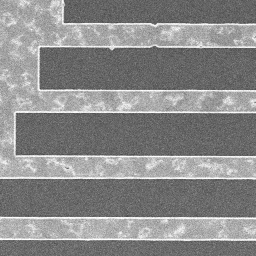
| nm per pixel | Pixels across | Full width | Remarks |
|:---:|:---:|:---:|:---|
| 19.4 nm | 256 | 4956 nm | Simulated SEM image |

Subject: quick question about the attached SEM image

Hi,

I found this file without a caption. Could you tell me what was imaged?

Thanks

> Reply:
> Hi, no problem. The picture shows one or a few lines or trenches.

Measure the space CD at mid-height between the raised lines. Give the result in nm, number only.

849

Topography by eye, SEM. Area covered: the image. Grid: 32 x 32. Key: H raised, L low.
HHHHHHHHLLLLLLLLLLLLLLLLLLLLLLLL
HHHHHHHHLLLLLLLLLLLLLLLLLLLLLLLL
HHHHHHHHLLLLLLLLLLLLLLLLLLLLLLLL
HHHHHHHHHHHHHHHHHHHHHHHHHHHHHHHH
HHHHHHHHHHHHHHHHHHHHHHHHHHHHHHHH
HHHHHHHHHHHHHHHHHHHHHHHHHHHHHHHH
HHHHHLLLLLLLLLLLLLLLLLLLLLLLLLLL
HHHHHLLLLLLLLLLLLLLLLLLLLLLLLLLL
HHHHHLLLLLLLLLLLLLLLLLLLLLLLLLLL
HHHHHLLLLLLLLLLLLLLLLLLLLLLLLLLL
HHHHHLLLLLLLLLLLLLLLLLLLLLLLLLLL
HHHHHHHHHHHHHHHHHHHHHHHHHHHHHHHH
HHHHHHHHHHHHHHHHHHHHHHHHHHHHHHHH
HHHHHHHHHHHHHHHHHHHHHHHHHHHHHHHH
HHLLLLLLLLLLLLLLLLLLLLLLLLLLLLLL
HHLLLLLLLLLLLLLLLLLLLLLLLLLLLLLL
HHLLLLLLLLLLLLLLLLLLLLLLLLLLLLLL
HHLLLLLLLLLLLLLLLLLLLLLLLLLLLLLL
HHLLLLLLLLLLLLLLLLLLLLLLLLLLLLLL
HHLLLLLLLLLLLLLLLLLLLLLLLLLLLLLL
HHHHHHHHHHHHHHHHHHHHHHHHHHHHHHHH
HHHHHHHHHHHHHHHHHHHHHHHHHHHHHHHH
LLLLLLLLLLLLLLLLLLLLLLLLLLLLLLLL
LLLLLLLLLLLLLLLLLLLLLLLLLLLLLLLL
LLLLLLLLLLLLLLLLLLLLLLLLLLLLLLLL
LLLLLLLLLLLLLLLLLLLLLLLLLLLLLLLL
LLLLLLLLLLLLLLLLLLLLLLLLLLLLLLLL
HHHHHHHHHHHHHHHHHHHHHHHHHHHHHHHH
HHHHHHHHHHHHHHHHHHHHHHHHHHHHHHHH
HHHHHHHHHHHHHHHHHHHHHHHHHHHHHHHH
LLLLLLLLLLLLLLLLLLLLLLLLLLLLLLLL
LLLLLLLLLLLLLLLLLLLLLLLLLLLLLLLL